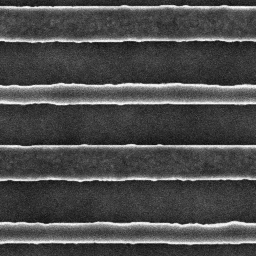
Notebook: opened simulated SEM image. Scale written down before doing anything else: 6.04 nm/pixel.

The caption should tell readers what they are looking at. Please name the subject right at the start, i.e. lines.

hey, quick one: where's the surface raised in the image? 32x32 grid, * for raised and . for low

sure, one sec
................................
********************************
********************************
********************************
********************************
................................
................................
................................
................................
................................
......................*.........
********************************
********************************
................................
................................
................................
................................
................................
********************************
********************************
********************************
********************************
*.***...****.***...*............
................................
................................
................................
................................
................................
********************************
********************************
................................
................................